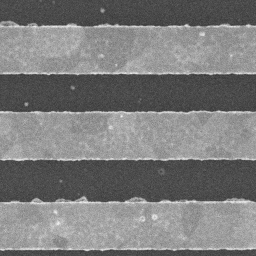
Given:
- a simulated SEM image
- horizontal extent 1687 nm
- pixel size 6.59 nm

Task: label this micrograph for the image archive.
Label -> lines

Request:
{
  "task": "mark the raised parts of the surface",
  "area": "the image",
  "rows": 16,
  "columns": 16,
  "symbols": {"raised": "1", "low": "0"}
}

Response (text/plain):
0000000000000000
0000000000000000
1111111111111111
1111111111111111
1111111111111111
0000000000000000
0000000000000000
1111111111111111
1111111111111111
1111111111111111
0000000000000000
0000000000000000
0000000000000000
1111111111111111
1111111111111111
1111111111111111